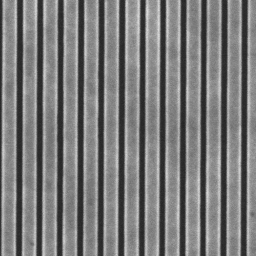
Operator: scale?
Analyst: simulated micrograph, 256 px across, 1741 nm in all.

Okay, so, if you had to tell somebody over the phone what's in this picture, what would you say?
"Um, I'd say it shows parallel lines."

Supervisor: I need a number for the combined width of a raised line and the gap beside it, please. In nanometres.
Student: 139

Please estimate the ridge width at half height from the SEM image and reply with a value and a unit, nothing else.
0.085 um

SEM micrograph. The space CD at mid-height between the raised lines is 51.9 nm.